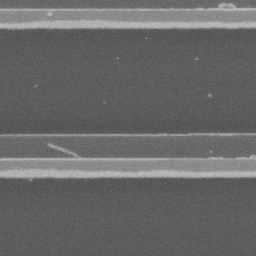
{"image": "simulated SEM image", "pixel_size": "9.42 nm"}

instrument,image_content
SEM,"lines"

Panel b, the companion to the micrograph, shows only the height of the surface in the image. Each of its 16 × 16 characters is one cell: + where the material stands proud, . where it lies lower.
++++++++++++++++
++++++++++++++++
................
................
................
................
................
................
++++++++++++++++
++++++++++++++++
++++++++++++++++
................
................
................
................
................